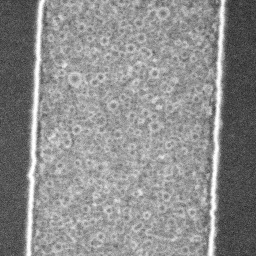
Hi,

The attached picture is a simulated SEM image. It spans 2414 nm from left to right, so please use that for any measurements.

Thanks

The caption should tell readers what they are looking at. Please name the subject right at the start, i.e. one or a few lines or trenches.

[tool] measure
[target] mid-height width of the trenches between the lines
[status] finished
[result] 1710 nm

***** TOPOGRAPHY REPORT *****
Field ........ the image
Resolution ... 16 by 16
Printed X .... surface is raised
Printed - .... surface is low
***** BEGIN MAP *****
XXX-----------XX
XX------------XX
XX------------XX
XX------------XX
XX------------XX
XX------------XX
XX------------XX
XX------------XX
XX------------XX
XX------------XX
XX-----------XXX
XX-----------XXX
XX-----------XXX
XX-----------XXX
XX-----------XXX
XX-----------XXX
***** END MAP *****